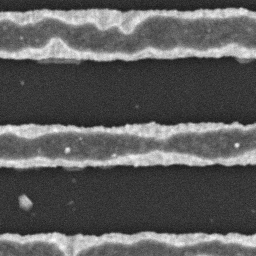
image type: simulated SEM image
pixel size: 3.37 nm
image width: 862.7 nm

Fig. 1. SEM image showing lines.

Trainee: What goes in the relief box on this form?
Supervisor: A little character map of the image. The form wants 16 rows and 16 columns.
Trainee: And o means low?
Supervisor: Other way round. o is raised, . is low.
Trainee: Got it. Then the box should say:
................
oooooooooooooooo
oooooooooooooooo
o....oooo.......
................
................
................
................
oooooooooooooooo
oooooooooooooooo
................
................
................
................
................
oooooooooooooooo